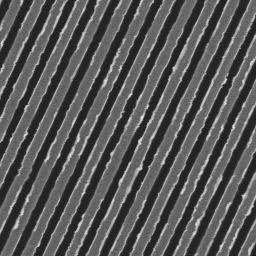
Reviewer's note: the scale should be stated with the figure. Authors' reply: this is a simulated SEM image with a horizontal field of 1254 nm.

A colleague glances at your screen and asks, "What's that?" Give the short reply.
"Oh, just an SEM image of parallel lines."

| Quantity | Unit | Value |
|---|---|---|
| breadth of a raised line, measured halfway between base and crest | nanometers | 58.2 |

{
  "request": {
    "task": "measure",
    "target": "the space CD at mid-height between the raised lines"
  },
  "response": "7.24 pixels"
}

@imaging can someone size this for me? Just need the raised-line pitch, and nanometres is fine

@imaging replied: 95.9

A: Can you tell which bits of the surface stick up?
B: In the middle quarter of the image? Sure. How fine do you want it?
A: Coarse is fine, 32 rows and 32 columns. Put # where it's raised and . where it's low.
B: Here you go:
.###..###...###..###..####..###.
###...###..###..####..###..####.
###..####..###..###..####..###..
###..###..###..####..###..####..
##..####..###..###...###..###..#
#...###..###...###..###...###..#
#..####..###..###...###..###..##
#..###..###...###..###..####..##
..####..###..###...###..###..###
..###..####..###..###...###..###
.####..###..###...###..###..####
.###..####..###..####..###..###.
####..###..####..###..###...###.
###..####..###..####..###..###..
###..###..####..###..###...###..
##..####..###..####..###..####..
##..###..####..###..###...###..#
#...###..###..####..###..###...#
#..###...###..###..####..###..##
...###..###..####..###..####..##
..###...###..###..####..###..###
..###..###..####..###..####..###
.###..####..###..####..###..###.
.###..###...###..###..####..###.
###...###..###..####..###..###..
###..###..####..####.####..###..
###..###..###..####..###..####..
##..###...###..###...###..###..#
#...###..###..####..###..####..#
#..####..###..###...###..###..##
#..###..####..###..###...###..##
..####..###..####..###..###..###